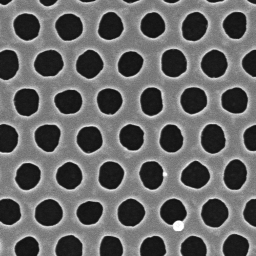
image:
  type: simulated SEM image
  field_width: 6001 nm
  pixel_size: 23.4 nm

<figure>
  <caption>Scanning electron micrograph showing a regular array of holes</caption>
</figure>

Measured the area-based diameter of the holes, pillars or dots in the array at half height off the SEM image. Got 630 nm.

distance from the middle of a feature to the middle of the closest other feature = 0.963 µm